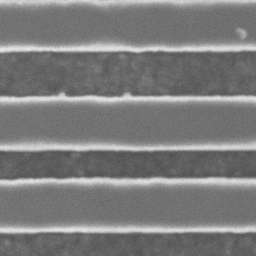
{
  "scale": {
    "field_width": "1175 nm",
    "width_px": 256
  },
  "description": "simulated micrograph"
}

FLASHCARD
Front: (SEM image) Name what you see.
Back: lines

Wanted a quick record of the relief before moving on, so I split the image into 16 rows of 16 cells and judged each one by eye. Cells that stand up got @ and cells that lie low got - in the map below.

@@@@@@@@@@@@@@@@
@@@@@@@@@@@@@@@@
@@@@@@@@@@@@@@@@
----------------
----------------
----------------
@@@@@@@@@@@@@@@@
@@@@@@@@@@@@@@@@
@@@@@@@@@@@@@@@@
----------------
----------------
@@@@@@@@@@@@@@@@
@@@@@@@@@@@@@@@@
@@@@@@@@@@@@@@@@
@@@--@@@--@@--@-
----------------